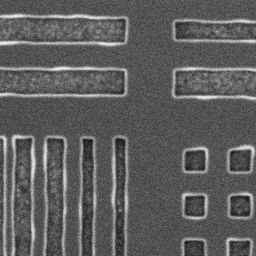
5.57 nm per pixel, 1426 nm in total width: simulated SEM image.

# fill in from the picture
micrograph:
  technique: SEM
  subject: groups of lines, slits or small figures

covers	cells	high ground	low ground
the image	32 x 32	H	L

HHHHHHHHHHHHHHHHHHHHHHHHHHHHHHHH
HHHHHHHHHHHHHHHHHHHHHHHHHHHHHHHH
LLLLLLLLLLLLLLLLHHHHHHHHHHHHHHHH
LLLLLLLLLLLLLLLLHHHHHHLLLLLLLLLL
LLLLLLLLLLLLLLLLHHHHHHLLLLLLLLLL
HHHHHHHHHHHHHHHHHHHHHHHHHHHHHHHH
HHHHHHHHHHHHHHHHHHHHHHHHHHHHHHHH
HHHHHHHHHHHHHHHHHHHHHHHHHHHHHHHH
HHHHHHHHHHHHHHHHHHHHHHHHHHHHHHHH
LLLLLLLLLLLLLLLLHHHHHHLLLLLLLLLL
LLLLLLLLLLLLLLLLHHHHHHLLLLLLLLLL
LLLLLLLLLLLLLLLLHHHHHHLLLLLLLLLL
HHHHHHHHHHHHHHHHHHHHHHHHHHHHHHHH
HHHHHHHHHHHHHHHHHHHHHHHHHHHHHHHH
HHHHHHHHHHHHHHHHHHHHHHHHHHHHHHHH
HHHHHHHHHHHHHHHHHHHHHHHHHHHHHHHH
HHHHHHHHHHHHHHHHHHHHHHHHHHHHHHHH
HHLLHHLLHHLLHHLLHHHHHHHHHHHHHHHH
LHLLHHLLHHLLHHLLHHHHHHHHHHHHHHHH
LHLLHHLLHHLLHHLLHHHHHHHLLLHHHLLL
LHLLHHLLHHLLHHLLHHHHHHHLLLHHHLLH
LHLLHHLLHHLLHHLLHHHHHHHHHHHHHLLH
LHLLHHLLHHLLHHLLHHHHHHHHHHHHHHHH
LHLLHHLLHHLLHHLLHHHHHHHHHHHHHHHH
LHLLHHLLHHLLHHLLHHHHHHHLLHHHHLLH
LHLLHHLLHHLLHHLLHHHHHHHLLLHHHLLH
LHLLHHLLHHLLHHLLHHHHHHHLLLHHHLLH
LHLLHHLLHHLLHHLLHHHHHHHHHHHHHHHH
LHLLHHLLHHLLHHLLHHHHHHHHHHHHHHHH
LHLLHHLLHHLLHHLLHHHHHHHHHHHHHHHH
LHLLHHLLHHLLHHLLHHHHHHHLLLHHHLLH
LHLLHHLLHHLLHHLLHHHHHHHLLLHHHLLH